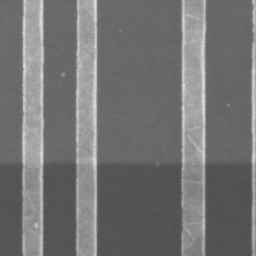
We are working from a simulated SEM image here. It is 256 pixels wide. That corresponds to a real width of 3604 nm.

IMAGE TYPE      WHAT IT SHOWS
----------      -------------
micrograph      lines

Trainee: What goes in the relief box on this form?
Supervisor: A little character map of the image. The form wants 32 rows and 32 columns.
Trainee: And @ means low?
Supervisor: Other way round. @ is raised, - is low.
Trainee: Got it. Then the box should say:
---@@-----@@-----------@@@------
---@@-----@@-----------@@@------
---@@-----@@-----------@@@------
---@@-----@@-----------@@@------
---@@-----@@-----------@@@------
---@@-----@@-----------@@-------
---@@-----@@-----------@@-------
---@@-----@@-----------@@-------
---@@-----@@-----------@@-------
---@@-----@@-----------@@-------
---@@-----@@-----------@@-------
---@@-----@@-----------@@-------
---@@-----@@-----------@@-------
---@@-----@@-----------@@-------
---@@-----@@-----------@@-------
---@@-----@@-----------@@-------
---@@-----@@-----------@@-------
---@@-----@@-----------@@-------
---@@-----@@-----------@@-------
---@@-----@@-----------@@-------
---@@-----@@-----------@@-------
---@@-----@@-----------@@-------
---@@-----@@-----------@@-------
---@@-----@@-----------@@-------
---@@-----@@-----------@@-------
---@@-----@@-----------@@-------
---@@-----@@-----------@@-------
---@@-----@@-----------@@-------
---@@-----@@-----------@@-------
---@@-----@@-----------@@-------
---@@-----@@-----------@@-------
---@@-----@@-----------@@-------